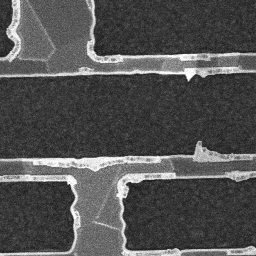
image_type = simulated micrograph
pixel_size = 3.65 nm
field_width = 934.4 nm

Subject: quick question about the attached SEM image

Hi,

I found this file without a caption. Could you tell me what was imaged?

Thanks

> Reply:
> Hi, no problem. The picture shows one or a few lines or trenches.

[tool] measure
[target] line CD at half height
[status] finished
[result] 77.1 nanometres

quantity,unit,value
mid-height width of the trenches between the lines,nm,278